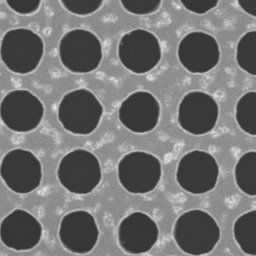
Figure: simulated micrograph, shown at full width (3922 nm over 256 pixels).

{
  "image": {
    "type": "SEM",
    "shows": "a regular array of holes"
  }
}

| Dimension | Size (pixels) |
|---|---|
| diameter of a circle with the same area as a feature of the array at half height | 42.8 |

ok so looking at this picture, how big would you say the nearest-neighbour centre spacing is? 0.898 micrometres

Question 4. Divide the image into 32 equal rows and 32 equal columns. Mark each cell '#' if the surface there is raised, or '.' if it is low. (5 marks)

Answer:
#....###.....##.....###....###..
##..#####...####...#####..#####.
################################
################################
#....###....###....####...####..
.....##......##.....###....###..
.....##......##.....##.....###..
.....###.....##.....##.....###..
#...####....####...####....###..
################################
################################
#...#####..######.######.######.
.....###....####....###....###..
.....##......##.....##.....###..
.....##......##.....##.....##...
#....###....###.....##.....###..
##.######..######.######..#####.
################################
################################
#...####....####...####....###..
.....##.....###.....##.....###..
.....##......##.....##.....##...
.....##.....###.....##.....##...
#...####....####...####....###..
################################
################################
##.######..############...#####.
.....###....####...###.....###..
.....##.....###.....##.....##...
.....##.....###.....##.....##...
#....###....###....###.....###..
#########..#####..#####...#####.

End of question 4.